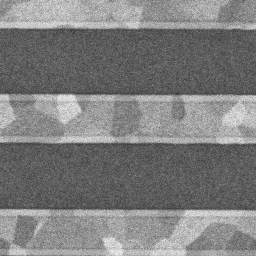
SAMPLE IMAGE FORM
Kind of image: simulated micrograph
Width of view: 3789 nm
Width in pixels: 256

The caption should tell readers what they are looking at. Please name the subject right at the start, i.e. one or a few lines or trenches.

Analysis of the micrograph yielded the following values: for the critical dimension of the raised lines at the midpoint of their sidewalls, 594 nanometres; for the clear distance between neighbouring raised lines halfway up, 1090 nanometres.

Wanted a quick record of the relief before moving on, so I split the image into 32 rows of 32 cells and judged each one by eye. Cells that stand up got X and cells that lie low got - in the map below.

XXXXXXXXXXXXXXXXXXXXXXXXXXXXXXXX
XXXXXXXXXXXXXXXXXXXXXXXXXXXXXXXX
XXXXXXXXXXXXXXXXXXXXXXXXXXXXXXXX
--------------------------------
--------------------------------
--------------------------------
--------------------------------
--------------------------------
--------------------------------
--------------------------------
--------------------------------
--------------------------------
XXXXXXXXXXXXXXXXXXXXXXXXXXXXXXXX
XXXXXXXXXXXXXXXXXXXXXXXXXXXXXXXX
XXXXXXXXXXXXXXXXXXXXXXXXXXXXXXXX
XXXXXXXXXXXXXXXXXXXXXXXXXXXXXXXX
XXXXXXXXXXXXXXXXXXXXXXXXXXXXXXXX
----------------------X---------
--------------------------------
--------------------------------
--------------------------------
--------------------------------
--------------------------------
--------------------------------
--------------------------------
--------------------------------
--------------------------------
XXXXXXXXXXXXXXXXXXXXXXXXXXXXXXXX
XXXXXXXXXXXXXXXXXXXXXXXXXXXXXXXX
XXXXXXXXXXXXXXXXXXXXXXXXXXXXXXXX
XXXXXXXXXXXXXXXXXXXXXXXXXXXXXXXX
------XXXXXXXXXXXXXXXXXXXXXXXXXX